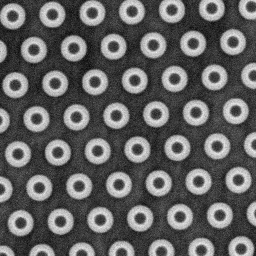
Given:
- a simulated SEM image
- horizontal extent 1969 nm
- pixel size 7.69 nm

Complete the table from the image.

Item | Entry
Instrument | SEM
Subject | an array of small figures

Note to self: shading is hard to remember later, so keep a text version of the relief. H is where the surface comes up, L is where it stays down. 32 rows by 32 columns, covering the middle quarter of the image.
LLLLLLLLLLLLLLLLLLLLLLLLLLLLLLLL
LLLLLLLLHLLLLLLLHHHLLLLLLHHHHHLL
LLLLLHHHHHLLLLLHHHHHLLLLLHHHHHHL
HLLLLHHHHHHLLLLHHHHHHLLLLHHHHHHL
HLLLLHHHHHHLLLLHHHHHHLLLLHHHHHHL
HLLLLHHHHHHLLLLHHHHHHLLLLHHHHHLL
HLLLLHHHHHLLLLLLHHHHLLLLLLHHHLLL
LLLLLLLHHLLLLLLLLLLLLLLLLLLLLLLL
LLLLLLLLLLLLLLLLLLLLLLLLLLLLLLLL
LLLLLLLLLLLLLLLLLLLLLLHHLLLLLLLH
LLHHLLLLLLLHHHHLLLLLLHHHHLLLLLHH
HHHHHHLLLLHHHHHHLLLLHHHHHHLLLLHH
HHHHHHLLLLHHHHHHLLLLHHHHHHLLLLHH
HHHHHHLLLLHHHHHHLLLLHHHHHHLLLLHH
HHHHHHLLLLHHHHHHLLLLHHHHHLLLLLLH
LHHHHLLLLLLHHHHLLLLLLLHHLLLLLLLL
LLLLLLLLLLLLLLLLLLLLLLLLLLLLLLLL
LLLLLLLLLLLLLLLLLLLLLLLLLLLLLLLL
LLLLLLLLLLLLLLLLLHHHLLLLLLHHHHLL
LLLLLLHHHHHLLLLLHHHHHLLLLLHHHHHL
HLLLLLHHHHHLLLLHHHHHHLLLLHHHHHHL
HHLLLHHHHHHHLLLHHHHHHLLLLHHHHHHL
HHLLLHHHHHHLLLLHHHHHHLLLLLHHHHHL
HLLLLLHHHHHLLLLLHHHHHLLLLLHHHHLL
HLLLLLLHHHLLLLLLLLHLLLLLLLLLLLLL
LLLLLLLLLLLLLLLLLLLLLLLLLLLLLLLL
LLLLLLLLLLLLLLLLLLLLLLLLLLLLLLLL
LLLHLLLLLLLLHHHLLLLLLLHHHHLLLLLH
LHHHHHLLLLLHHHHHLLLLLHHHHHHLLLLH
LHHHHHHLLLLHHHHHHLLLLHHHHHHLLLLH
LHHHHHHLLLLHHHHHHLLLLHHHHHHLLLLH
LHHHHHHLLLLHHHHHHLLLLHHHHHLLLLLH